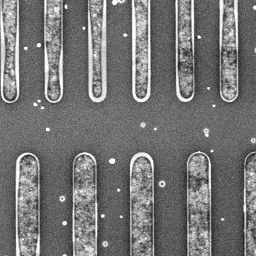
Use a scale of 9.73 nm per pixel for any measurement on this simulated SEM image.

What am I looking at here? groups of lines, slits or small figures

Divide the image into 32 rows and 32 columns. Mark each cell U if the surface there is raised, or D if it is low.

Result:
UUDDDDUUDDDUUDDDDUUDDDUUDDDDUDDD
UUDDDDUUDDDUUDDDDUUDDDUUDDDDUDDD
UUDDDDUUDDDUUDDDDUUDDDUUDDDDUUDD
UUDDDDUUDDDUUDDDDUUDDDUUDDDDUUDD
UUDDDDUUDDDUUDDDDUUDDDUUDDDDUUDD
UUDDDDUUDDDUUDDDDUUDDDUUDDDDUUDD
UUDDDDUUDDDUUDDDDUUDDDUUDDDDUUDD
UUDDDDUUDDDUUDDDDUUDDDUUDDDDUUDD
UUDDDDUUDDDUUDDDDUUDDDUUDDDDUUDD
UUDDDDUUDDDUUDDDDUUDDDUUDDDDUUDD
UUDDDDUUDDDUUDDDDUUDDDUUDDDDUUDD
UUDDDDUUDDDUUDDDDUDDDDUUDDDDUUDD
DUDDDDUDDDDDDDDDDDDDDDDDDDDDUDDD
DDDDDDDDDDDDDDDDDDDDDDDDDDDDDDDD
DDDDDDDDDDDDDDDDDDDDDDDDDDDDDDDD
DDDDDDDDDDDDDDDDDDDDDDDDDDDDDDDD
DDDDDDDDDDDDDDDDDDDDDDDDDDDDDDDD
DDDDDDDDDDDDDDDDDDDDDDDDDDDDDDDD
DDDDDDDDDDDDDDDDDDDDDDDDDDDDDDDD
DDDUDDDDDDUDDDDDDUDDDDDDUUDDDDDU
DDUUUDDDDUUUDDDDDUUDDDDDUUDDDDDU
DDUUUDDDDUUUDDDDUUUDDDDDUUDDDDDU
DDUUUDDDDUUUDDDDUUUDDDDDUUDDDDDU
DDUUUDDDDUUUDDDDUUUDDDDDUUDDDDDU
DDUUUDDDDUUUDDDDUUUDDDDDUUDDDDDU
DDUUUDDDDUUUDDDDUUUDDDDDUUDDDDDU
DDUUUDDDDUUUDDDDUUUDDDDDUUDDDDDU
DDUUUDDDDUUUDDDDUUUDDDDDUUDDDDDU
DDUUUDDDDUUUDDDDUUUDDDDDUUDDDDDU
DDUUUDDDDUUUDDDDUUUDDDDDUUDDDDDU
DDUUUDDDDUUUDDDDUUUDDDDDUUDDDDDU
DDUUUDDDDUUUDDDDUUUDDDDDUUDDDDDU